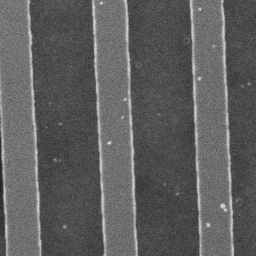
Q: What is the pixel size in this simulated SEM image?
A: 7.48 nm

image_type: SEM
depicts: lines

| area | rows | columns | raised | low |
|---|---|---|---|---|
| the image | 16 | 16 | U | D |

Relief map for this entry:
UUDDDDUUDDDDUUDD
UUDDDDUUDDDDUUDD
UUDDDDUUDDDDUUDD
UUDDDDUUDDDDUUDD
UUDDDDUUDDDDUUDD
UUDDDDUUDDDDUUDD
UUDDDDUUDDDDUUDD
UUDDDDUUDDDDUUDD
UUDDDDUUDDDDUUDD
UUDDDDUUDDDDUUDD
UUDDDDUUDDDDUUDD
UUDDDDUUDDDDUUDD
UUDDDDUUDDDDUUDD
UUDDDDUUDDDDUUUD
UUDDDDUUDDDDUUUD
UUUDDDUUUDDDDUUD